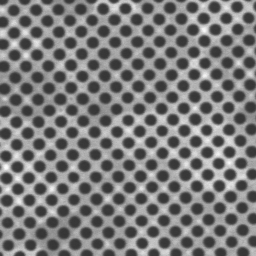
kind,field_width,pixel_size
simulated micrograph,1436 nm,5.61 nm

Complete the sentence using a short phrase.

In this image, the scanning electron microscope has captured a regular array of holes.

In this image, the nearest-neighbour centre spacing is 87.7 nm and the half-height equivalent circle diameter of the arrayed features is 11.9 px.